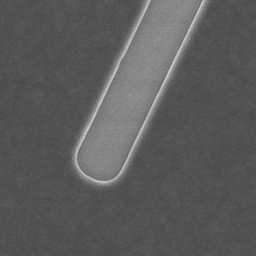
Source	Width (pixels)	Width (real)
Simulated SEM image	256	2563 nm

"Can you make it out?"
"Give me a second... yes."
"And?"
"one or a few lines or trenches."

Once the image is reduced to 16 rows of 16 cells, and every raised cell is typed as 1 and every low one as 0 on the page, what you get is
1111111110000111
1111111110001111
1111111100001111
1111111100011111
1111111000011111
1111111000111111
1111110000111111
1111110001111111
1111100001111111
1111100011111111
1111100011111111
1111111111111111
1111111111111111
1111111111111111
1111111111111111
1111111111111111